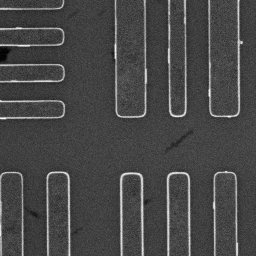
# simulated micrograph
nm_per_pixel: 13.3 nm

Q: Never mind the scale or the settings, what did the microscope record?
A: groups of lines, slits or small figures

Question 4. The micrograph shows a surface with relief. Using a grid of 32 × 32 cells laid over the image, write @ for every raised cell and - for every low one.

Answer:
@@@@@@@@------@@@@---@@---@@@@--
--------------@@@@---@@---@@@@--
--------------@@@@---@@---@@@@--
--------------@@@@---@@---@@@@--
@@@@@@@@------@@@@---@@---@@@@--
@@@@@@@@------@@@@---@@---@@@@--
--------------@@@@---@@---@@@@--
--------------@@@@---@@---@@@@--
@@@@@@@@------@@@@---@@---@@@@--
@@@@@@@@------@@@@---@@---@@@@--
--------------@@@@---@@---@@@@--
--------------@@@@---@@---@@@@--
--------------@@@@---@@---@@@@--
@@@@@@@@------@@@@---@@---@@@@--
@@@@@@@@-------@@@----@----@@---
--------------------------------
--------------------------------
--------------------------------
--------------------------------
--------------------------------
--------------------------------
--------------------------------
@@@---@@@------@@@---@@@---@@---
@@@---@@@------@@@---@@@---@@---
@@@---@@@------@@@---@@@---@@@--
@@@---@@@------@@@---@@@---@@@--
@@@---@@@------@@@---@@@---@@@--
@@@---@@@------@@@---@@@---@@@--
@@@---@@@------@@@---@@@---@@@--
@@@---@@@------@@@---@@@---@@@--
@@@---@@@------@@@---@@@---@@@--
@@@---@@@------@@@---@@@---@@@--